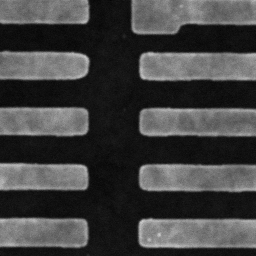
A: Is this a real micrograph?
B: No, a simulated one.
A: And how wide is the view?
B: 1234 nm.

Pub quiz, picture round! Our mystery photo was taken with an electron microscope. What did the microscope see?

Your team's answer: wiring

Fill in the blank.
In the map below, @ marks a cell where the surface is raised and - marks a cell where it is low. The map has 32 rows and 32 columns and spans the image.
@@@@@@@@@@@------@@@@@@@@@@@@@@@
@@@@@@@@@@@------@@@@@@@@@@@@@@@
@@@@@@@@@@@------@@@@@@@@@@@@@@@
-----------------@@@@@----------
--------------------------------
--------------------------------
--------------------------------
@@@@@@@@@@@-------@@@@@@@@@@@@@@
@@@@@@@@@@@-------@@@@@@@@@@@@@@
@@@@@@@@@@--------@@@@@@@@@@@@@@
--------------------------------
--------------------------------
--------------------------------
--------------------------------
@@@@@@@@@@@-------@@@@@@@@@@@@@@
@@@@@@@@@@@-------@@@@@@@@@@@@@@
@@@@@@@@@@--------@@@@@@@@@@@@@@
--------------------------------
--------------------------------
--------------------------------
--------------------------------
@@@@@@@@@@@-------@@@@@@@@@@@@@@
@@@@@@@@@@@-------@@@@@@@@@@@@@@
@@--@@@@@@--------@@@@@@@@@@@@@@
--------------------------------
--------------------------------
--------------------------------
@@@@@@@-@@----------------------
@@@@@@@@@@@------@@@@@@@@@@@@@@@
@@@@@@@@@@@------@@@@@@@@@@@@@@@
@@@@@@@@@@--------@@@@@@@@@@@@@@
--------------------------------